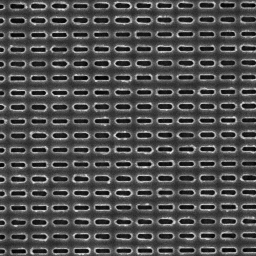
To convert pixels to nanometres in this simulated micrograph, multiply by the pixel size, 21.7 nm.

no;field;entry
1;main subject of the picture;a regular array of holes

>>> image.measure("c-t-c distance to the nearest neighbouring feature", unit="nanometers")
309